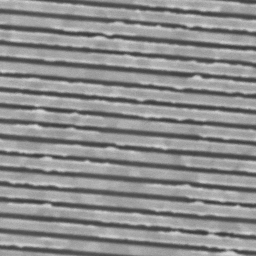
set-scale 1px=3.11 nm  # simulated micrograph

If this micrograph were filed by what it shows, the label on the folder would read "parallel lines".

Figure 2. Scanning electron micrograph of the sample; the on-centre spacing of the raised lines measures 15.7 px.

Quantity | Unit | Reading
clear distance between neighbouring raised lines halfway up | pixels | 5.11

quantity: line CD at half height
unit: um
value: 0.0318